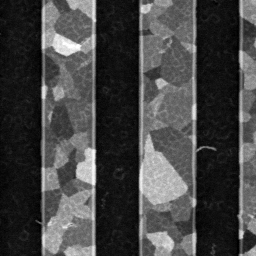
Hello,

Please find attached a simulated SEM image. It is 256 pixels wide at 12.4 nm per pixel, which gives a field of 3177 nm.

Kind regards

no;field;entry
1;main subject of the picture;one or a few lines or trenches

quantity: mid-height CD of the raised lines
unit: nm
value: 636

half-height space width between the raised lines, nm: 594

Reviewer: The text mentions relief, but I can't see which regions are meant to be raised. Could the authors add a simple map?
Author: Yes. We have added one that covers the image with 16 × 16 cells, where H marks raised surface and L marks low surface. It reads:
LLLHHHLLLHHHLLLH
LLLHHHLLLHHHLLLH
LLLHHHLLLHHHLLLH
LLLHHHLLLHHHLLLH
LLLHHHLLLHHHLLLH
LLLHHHLLLHHHLLLH
LLLHHHLLLHHHLLLH
LLLHHHLLLHHHLLLH
LLLHHHLLLHHHLLLH
LLLHHHLLLHHHLLLH
LLLHHHLLLHHHLLLH
LLLHHHLLLHHHLLLH
LLLHHHLLLHHHLLLH
LLLHHHLLLHHHLLLH
LLLHHHLLLHHHLLLH
LLLHHHLLLHHHLLLH